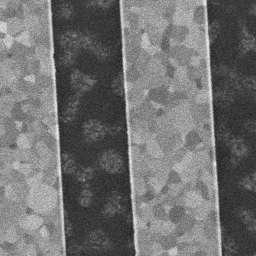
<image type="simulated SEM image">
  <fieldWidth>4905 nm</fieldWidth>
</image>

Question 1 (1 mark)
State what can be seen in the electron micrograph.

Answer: one or a few lines or trenches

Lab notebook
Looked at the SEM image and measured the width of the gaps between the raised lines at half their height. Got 70.6 pixels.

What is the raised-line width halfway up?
1620 nm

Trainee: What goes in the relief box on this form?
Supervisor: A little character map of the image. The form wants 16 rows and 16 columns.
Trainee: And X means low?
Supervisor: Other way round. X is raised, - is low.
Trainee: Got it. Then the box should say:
XXX-----XXXXX---
XXX-----XXXXX---
XXX-----XXXXX---
XXX-----XXXXX---
XXX-----XXXXX---
XXX-----XXXXX---
XXXX----XXXXX---
XXXX----XXXXX---
XXXX----XXXXX---
XXXX----XXXXX---
XXXX----XXXXX---
XXXX----XXXXXX--
XXXX----XXXXXX--
XXXX----XXXXXX--
XXXX----XXXXXX--
XXXX----XXXXXX--